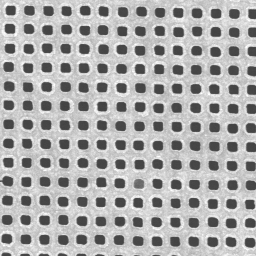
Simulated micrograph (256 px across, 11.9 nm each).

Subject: a regular array of holes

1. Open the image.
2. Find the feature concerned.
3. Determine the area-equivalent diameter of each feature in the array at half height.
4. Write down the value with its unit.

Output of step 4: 132 nanometres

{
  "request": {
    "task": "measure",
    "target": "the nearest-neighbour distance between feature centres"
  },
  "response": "0.219 um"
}